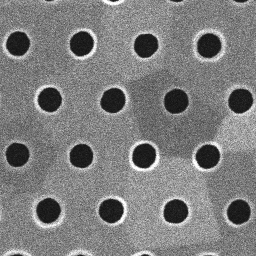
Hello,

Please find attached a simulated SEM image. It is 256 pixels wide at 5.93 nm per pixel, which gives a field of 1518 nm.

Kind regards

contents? a regular array of holes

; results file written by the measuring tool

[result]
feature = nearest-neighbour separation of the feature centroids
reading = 63.1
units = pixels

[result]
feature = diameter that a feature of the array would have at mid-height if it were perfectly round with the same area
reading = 143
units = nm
